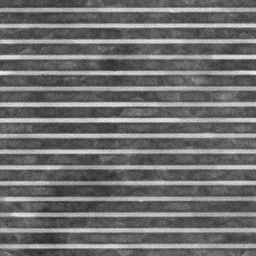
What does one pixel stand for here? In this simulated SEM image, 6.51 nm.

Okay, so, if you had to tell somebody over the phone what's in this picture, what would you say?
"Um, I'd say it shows parallel lines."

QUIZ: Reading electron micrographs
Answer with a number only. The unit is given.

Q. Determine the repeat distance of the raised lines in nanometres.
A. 102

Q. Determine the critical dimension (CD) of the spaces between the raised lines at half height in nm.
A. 82.2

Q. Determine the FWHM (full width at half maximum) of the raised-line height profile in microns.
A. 0.0236